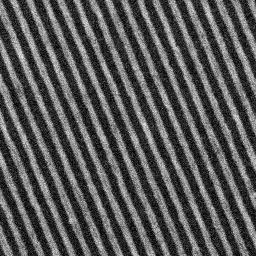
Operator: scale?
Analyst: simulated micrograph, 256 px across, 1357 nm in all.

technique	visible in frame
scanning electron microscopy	parallel lines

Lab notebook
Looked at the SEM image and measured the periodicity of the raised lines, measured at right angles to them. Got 0.0772 microns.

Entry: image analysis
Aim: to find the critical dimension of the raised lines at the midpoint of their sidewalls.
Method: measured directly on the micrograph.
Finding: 25.1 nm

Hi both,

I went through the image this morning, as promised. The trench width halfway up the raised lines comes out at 50.1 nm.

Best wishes